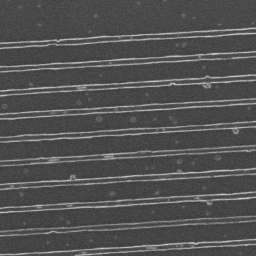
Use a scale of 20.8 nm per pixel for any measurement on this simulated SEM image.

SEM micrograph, parallel lines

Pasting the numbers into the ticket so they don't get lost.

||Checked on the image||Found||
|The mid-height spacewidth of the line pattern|18.3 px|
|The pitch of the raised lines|23.4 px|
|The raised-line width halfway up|114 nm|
